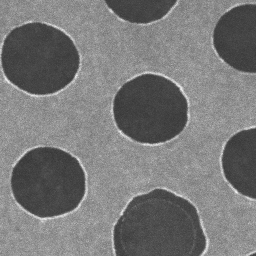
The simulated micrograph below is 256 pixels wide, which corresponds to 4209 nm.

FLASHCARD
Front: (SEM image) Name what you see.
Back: holes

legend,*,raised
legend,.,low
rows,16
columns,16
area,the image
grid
*******....****.
**.***********..
....*********...
.....*********..
.....**********.
*...****...*****
*******.....****
*******.....****
********...****.
**..**********..
*....*********..
*....*********..
*....***....****
**..****....****
*******......***
*******......***